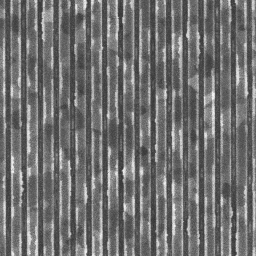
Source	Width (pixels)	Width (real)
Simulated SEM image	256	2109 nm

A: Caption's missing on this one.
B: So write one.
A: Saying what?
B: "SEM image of parallel lines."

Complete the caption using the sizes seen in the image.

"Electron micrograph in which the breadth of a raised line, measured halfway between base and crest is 0.0834 um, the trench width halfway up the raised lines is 46.3 nm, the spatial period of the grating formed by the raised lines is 133 nanometers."